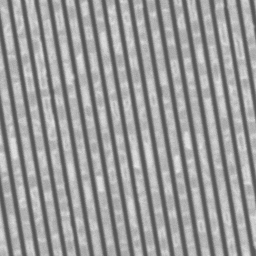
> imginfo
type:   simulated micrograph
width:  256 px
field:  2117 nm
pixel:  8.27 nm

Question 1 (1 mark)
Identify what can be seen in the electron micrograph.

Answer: parallel lines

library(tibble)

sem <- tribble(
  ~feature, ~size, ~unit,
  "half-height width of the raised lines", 69.3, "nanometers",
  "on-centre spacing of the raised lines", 0.11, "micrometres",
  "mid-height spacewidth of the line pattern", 0.0408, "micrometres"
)